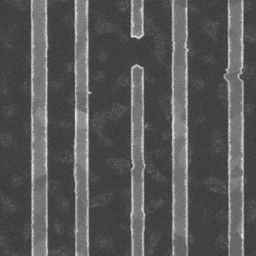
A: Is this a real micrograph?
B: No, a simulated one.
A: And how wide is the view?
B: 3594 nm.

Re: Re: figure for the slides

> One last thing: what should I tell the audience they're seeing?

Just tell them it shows parallel lines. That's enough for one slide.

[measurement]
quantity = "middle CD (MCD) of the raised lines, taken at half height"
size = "14.4 px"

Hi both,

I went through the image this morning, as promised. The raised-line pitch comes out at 689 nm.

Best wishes